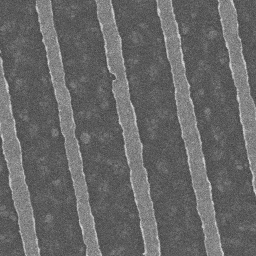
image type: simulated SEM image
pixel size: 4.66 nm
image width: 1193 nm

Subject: parallel lines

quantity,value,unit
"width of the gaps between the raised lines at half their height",0.209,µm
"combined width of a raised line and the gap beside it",59.6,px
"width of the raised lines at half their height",0.0681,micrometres